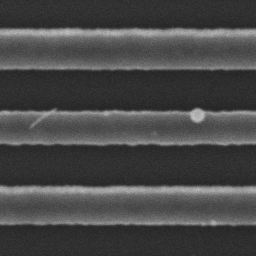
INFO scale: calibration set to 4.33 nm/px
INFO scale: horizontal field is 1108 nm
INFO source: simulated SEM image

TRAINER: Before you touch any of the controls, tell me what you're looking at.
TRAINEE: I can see lines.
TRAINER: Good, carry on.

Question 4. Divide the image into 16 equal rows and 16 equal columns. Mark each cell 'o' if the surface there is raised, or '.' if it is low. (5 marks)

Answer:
................
................
oooooooooooooooo
oooooooooooooooo
................
................
................
oooooooooooooooo
oooooooooooooooo
................
................
................
oooooooooooooooo
oooooooooooooooo
................
................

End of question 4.